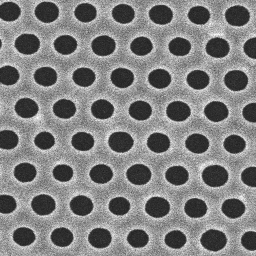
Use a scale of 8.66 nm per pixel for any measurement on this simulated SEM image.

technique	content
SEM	a regular array of holes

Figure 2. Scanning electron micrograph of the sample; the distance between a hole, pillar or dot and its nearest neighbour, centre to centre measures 0.321 µm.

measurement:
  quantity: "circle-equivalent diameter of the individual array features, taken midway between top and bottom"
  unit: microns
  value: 0.189